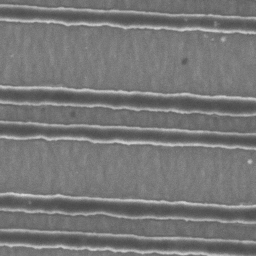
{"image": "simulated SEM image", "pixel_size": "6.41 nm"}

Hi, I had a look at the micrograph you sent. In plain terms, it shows lines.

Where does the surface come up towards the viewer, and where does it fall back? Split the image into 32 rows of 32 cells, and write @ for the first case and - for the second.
--------------------------------
@@@@@@@@@@@@@@@@@---------------
@@@@@@@@@@@@@@@@@@@@@@@@@@@@@@@@
---------------@@@@@@@@@@@@@@@@@
--------------------------------
--------------------------------
--------------------------------
--------------------------------
--------------------------------
--------------------------------
--------------------------------
@@@@@@@@@@@@@@@@----------------
@@@@@@@@@@@@@@@@@@@@@@@@@@@@@@@@
--------------@-@@@@@@@@@@@@@@@@
--------------------------------
@@@@@@--------------------------
@@@@@@@@@@@@@@@@@@@@@@@@@-------
-----------@@@@@@@@@@@@@@@@@@@@@
----------------------------@@@@
--------------------------------
--------------------------------
--------------------------------
--------------------------------
--------------------------------
@@@@@-@@------------------------
@@@@@@@@@@@@@@@@@@@@@@@@@-------
---@@@@@@@@@@@@@@@@@@@@@@@@@@@@@
------------------------@@@@@@@@
--------------------------------
@@@@@@@@@@@@@@@@@---------------
@@@@@@@@@@@@@@@@@@@@@@@@@@@@@@@@
-----------------@@@@@@@@@@@@@@@